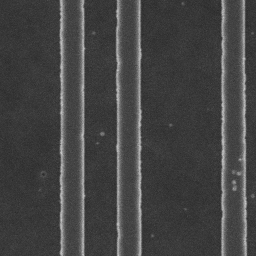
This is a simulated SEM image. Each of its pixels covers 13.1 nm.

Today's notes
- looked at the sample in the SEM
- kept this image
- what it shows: lines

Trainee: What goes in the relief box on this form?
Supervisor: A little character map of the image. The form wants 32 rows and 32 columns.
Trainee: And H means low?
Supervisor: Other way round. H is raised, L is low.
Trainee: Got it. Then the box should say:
LLLLLLLLHHLLLLLHHLLLLLLLLLLLHHHL
LLLLLLLLHHLLLLLHHLLLLLLLLLLLHHHL
LLLLLLLLHHLLLLLHHLLLLLLLLLLLHHHL
LLLLLLLLHHLLLLLHHLLLLLLLLLLLHHHL
LLLLLLLLHHLLLLLHHLLLLLLLLLLLHHHL
LLLLLLLLHHLLLLLHHLLLLLLLLLLLHHHL
LLLLLLLLHHHLLLLHHHLLLLLLLLLLHHHL
LLLLLLLLHHLLLLLHHHLLLLLLLLLLHHHL
LLLLLLLLHHLLLLLHHLLLLLLLLLLLHHHL
LLLLLLLLHHLLLLLHHLLLLLLLLLLLHHHL
LLLLLLLLHHLLLLLHHLLLLLLLLLLLHHHL
LLLLLLLLHHLLLLLHHLLLLLLLLLLLHHHL
LLLLLLLLHHLLLLLHHLLLLLLLLLLLHHHL
LLLLLLLLHHLLLLLHHHLLLLLLLLLLHHHL
LLLLLLLLHHLLLLLHHHLLLLLLLLLLHHHL
LLLLLLLLHHLLLLLHHHLLLLLLLLLLHHHL
LLLLLLLLHHLLLLLHHLLLLLLLLLLLHHHL
LLLLLLLLHHLLLLLHHHLLLLLLLLLLHHHL
LLLLLLLLHHLLLLLHHHLLLLLLLLLLHHHL
LLLLLLLLHHLLLLLHHLLLLLLLLLLLHHHL
LLLLLLLLHHLLLLLHHHLLLLLLLLLLHHHL
LLLLLLLLHHLLLLLHHHLLLLLLLLLLHHHL
LLLLLLLLHHLLLLLHHHLLLLLLLLLLHHHL
LLLLLLLLHHLLLLLHHHLLLLLLLLLLHHHL
LLLLLLLLHHHLLLLHHHLLLLLLLLLLHHHL
LLLLLLLLHHLLLLLHHHLLLLLLLLLLHHHL
LLLLLLLLHHLLLLLHHHLLLLLLLLLLHHHL
LLLLLLLLHHLLLLLHHHLLLLLLLLLLHHHL
LLLLLLLLHHLLLLLHHHLLLLLLLLLLHHHL
LLLLLLLLHHLLLLLHHHLLLLLLLLLLHHHL
LLLLLLLLHHLLLLLHHHLLLLLLLLLLHHHL
LLLLLLLLHHLLLLLHHHLLLLLLLLLLHHHL